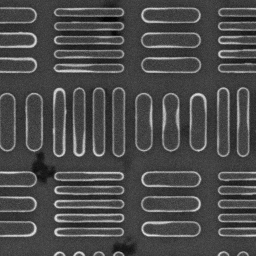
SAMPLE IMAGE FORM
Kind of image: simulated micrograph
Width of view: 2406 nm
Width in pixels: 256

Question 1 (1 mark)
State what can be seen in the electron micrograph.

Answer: groups of lines, slits or small figures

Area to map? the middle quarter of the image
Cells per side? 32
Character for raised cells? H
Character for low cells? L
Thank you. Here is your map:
HHHHHHHHHHHHHHHLLLLLHHHHHHHHHHHH
HHHHHHHHHHHHHHHLLLLLHHHHHHHHHHHH
LLLLLLLLLLLLLLLLLLLLLLLLLLLLLLLL
LLLLLLLLLLLLLLLLLLLLLLLLLLLLLLLL
LLLLLLLLLLLLLLLLLLLLLLLLLLLLLLLL
LLLLLLLLLLLLLLLLLLLLLLLLLLLLLLLL
LLLHHLLLHHLLLHHLLLLLLLLLLLLLLLLL
LLLHHLLHHHLLHHHLLLLHHLLLLLHLLLLL
LLLHHLLHHHLLHHHLLLHHHHLLLHHHLLLL
LLLHHLLHHHLLHHHLLLHHHHLLLHHHHLLL
LLLHHLLHHHLLHHHLLLHHHHLLLHHHHLLL
LLLHHLLHHHLLHHHLLLHHHHLLLHHHHLLL
LLLHHLLHHHLLHHHLLLHHHHLLLHHHLLLL
LLLHHLLHHHLLHHHLLLHHHHLLLHHHLLLL
LLLHHLLHHHLLHHHLLLHHHHLLLHHHLLLL
LLLHHLLHHHLLHHHLLLHHHHLLLHHHHLLL
LLLHHLLHHHLLHHHLLLHHHHLLLHHHHLLL
LLLHHLLHHHLLHHHLLLHHHHLLLHHHHLLL
LLLHHLLHHHLLHHHLLLHHHHLLLHHHHLLL
LLLHHLLHHHLLHHHLLLHHHHLLLHHHHLLL
LLLHHLLHHHLLHHHLLLHHHHLLLHHHHLLL
LLLHHLLHHHLLHHHLLLLHHLLLLLHHLLLL
LLLHLLLLHHLLLHHLLLLLLLLLLLLLLLLL
LLLLLLLLLLLLLLLLLLLLLLLLLLLLLLLL
LLLLLLLLLLLLLLLLLLLLLLLLLLLLLLLL
LLLLLLLLLLLLLLLLLLLLLLLLLLLLLLLL
LLLLLLLLLLLLLLLLLLLLLLLLLLLLLLLL
HHHHHHHHHHHHHHLLLLLLHHHHHHHHHHHH
HHHHHHHHHHHHHHHLLLLLHHHHHHHHHHHH
LLLLLLLLLLLLLLLLLLLLHHHHHHHHHHHH
LLLLLLLLLLLLLLLLLLLLLLLLLLLLHHHH
HHHHHHHHHHHHHHHLLLLLLLLLLLLLLLLL